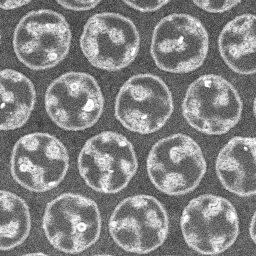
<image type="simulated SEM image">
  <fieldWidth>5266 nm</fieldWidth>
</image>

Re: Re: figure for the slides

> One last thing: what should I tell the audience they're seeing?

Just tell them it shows a regular array of raised bodies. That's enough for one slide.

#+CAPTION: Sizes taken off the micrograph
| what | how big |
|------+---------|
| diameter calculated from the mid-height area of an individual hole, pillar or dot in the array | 1180 nm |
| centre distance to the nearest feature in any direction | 1410 nm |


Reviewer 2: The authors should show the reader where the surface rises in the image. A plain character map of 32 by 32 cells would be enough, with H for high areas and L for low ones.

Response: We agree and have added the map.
HHHLLLLLHHHHLLLLHHHHLLLLLHHHHLLL
LLLLLHLLLLLLLLLLLLLLLLLLLLLLLLLL
LLLHHHHHLLLLHHHHLLLLLHHHLLLLLHHH
LLHHHHHHLLLHHHHHHLLLHHHHHLLLHHHH
LLHHHHHHHLHHHHHHHLLHHHHHHHLLHHHH
LLHHHHHHLLHHHHHHHLLHHHHHHHLLHHHH
LLHHHHHHLLLHHHHHHLLHHHHHHHLLHHHH
LLLHHHHLLLLHHHHHLLLHHHHHHLLLHHHH
LLLLLLLLLLLLLHHLLLLLHHHHLLLLLHHH
HHLLLLLLHHHLLLLLLLHLLLLLLLLLLLLL
HHHHLLLHHHHHLLLLHHHHLLLLHHHHHLLL
HHHHLLHHHHHHLLLHHHHHHLLLHHHHHLLL
HHHHLLHHHHHHHLLHHHHHHLLHHHHHHHLL
HHHHLLHHHHHHHLLHHHHHHLLHHHHHHHLL
HHHLLLHHHHHHLLLHHHHHHLLHHHHHHHLL
HHHLLLLHHHHLLLLLHHHHLLLLHHHHHLLL
LLLLLLLLLLLLLLLLLLLLLLLLLLHHLLLL
LLLHHHHLLLLHHHHHLLLLLHHHLLLLLHHH
LLHHHHHHLLLHHHHHLLLHHHHHHLLLHHHH
LLHHHHHHLLHHHHHHHLLHHHHHHLLHHHHH
LLHHHHHHLLHHHHHHHLLHHHHHHHLHHHHH
LLHHHHHHLLHHHHHHHLLHHHHHHLLHHHHH
LLHHHHHHLLLHHHHHLLLHHHHHHLLLHHHH
LLLLHHLLLLLLHHHLLLLLHHHHLLLLLHHH
HHLLLLLLHHLLLLLLLLLLLLLLLLLLLLLL
HHHLLLHHHHHHLLLHHHHHLLLLHHHHHLLL
HHHLLLHHHHHHLLHHHHHHHLLHHHHHHLLL
HHHHLLHHHHHHLLHHHHHHHLLHHHHHHHLL
HHHHLLHHHHHHLLHHHHHHHLLHHHHHHHLH
HHHLLLHHHHHHLLHHHHHHLLLHHHHHHLLL
HHLLLLLHHHHLLLLHHHHHLLLLHHHHHLLL
LLLLLLLLLLLLLLLLLLLLLLLLLHHLLLLL